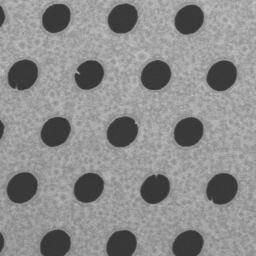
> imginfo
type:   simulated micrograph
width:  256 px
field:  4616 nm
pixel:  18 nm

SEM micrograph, a regular array of holes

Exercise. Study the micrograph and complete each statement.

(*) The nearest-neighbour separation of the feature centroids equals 65.4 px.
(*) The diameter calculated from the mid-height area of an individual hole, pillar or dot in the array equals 550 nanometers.